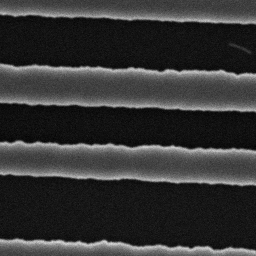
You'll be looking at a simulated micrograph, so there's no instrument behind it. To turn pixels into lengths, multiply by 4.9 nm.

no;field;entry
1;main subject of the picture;lines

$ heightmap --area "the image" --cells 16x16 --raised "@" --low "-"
@@@@@@@@@@@@@@@@
----------------
----------------
----------------
@@@@@@@@@@@@@@--
@@@@@@@@@@@@@@@@
-@@@@@@@@@@@@@@@
----------------
----------------
@@@@@@@@@@@@@@@@
@@@@@@@@@@@@@@@@
--------------@@
----------------
----------------
----------------
@@@@@@@@@@@@@---